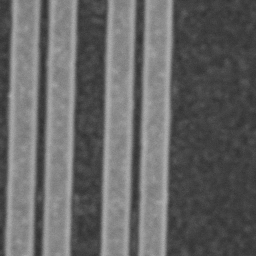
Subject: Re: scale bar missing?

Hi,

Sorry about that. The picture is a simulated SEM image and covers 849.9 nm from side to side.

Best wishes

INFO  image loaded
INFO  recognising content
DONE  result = parallel lines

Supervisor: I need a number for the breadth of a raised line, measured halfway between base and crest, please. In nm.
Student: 83